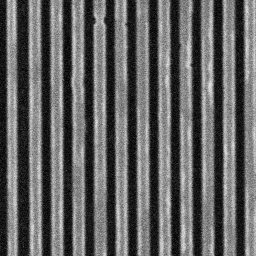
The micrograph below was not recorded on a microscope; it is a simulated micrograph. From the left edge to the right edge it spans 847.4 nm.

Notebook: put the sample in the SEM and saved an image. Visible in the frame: parallel lines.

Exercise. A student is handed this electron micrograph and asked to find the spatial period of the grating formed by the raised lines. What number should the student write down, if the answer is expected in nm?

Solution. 71.8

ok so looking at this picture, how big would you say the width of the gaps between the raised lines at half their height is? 31.8 nm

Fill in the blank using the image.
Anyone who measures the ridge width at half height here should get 37.6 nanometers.